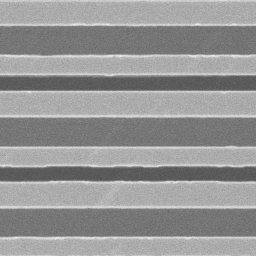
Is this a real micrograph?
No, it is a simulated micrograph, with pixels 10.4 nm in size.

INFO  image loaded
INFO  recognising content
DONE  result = lines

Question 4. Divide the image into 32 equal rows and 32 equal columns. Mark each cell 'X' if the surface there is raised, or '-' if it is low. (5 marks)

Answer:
XXXXXXXXXXXXXXXXXXXXXXXXXXXXXXXX
XXXXXXXXXXXXXXXXXXXXXXXXXXXXXXXX
XXXXXXXXXXXXXXXXXXXXXXXXXXXXXXXX
--------------------------------
--------------------------------
--------------------------------
--------------------------------
XXXXXXXXXXXXXXXXXXXXXXXXXXXXXXXX
XXXXXXXXXXXXXXXXXXXXXXXXXXXXXXXX
--------------------------------
--------------------------------
XXXXXXXXXXXXXXXXXXXXXXXXXXXXXXXX
XXXXXXXXXXXXXXXXXXXXXXXXXXXXXXXX
XXXXXXXXXXXXXXXXXXXXXXXXXXXXXXXX
XXXXXXXXXXXXXXXXXXXXXXXXXXXXXXXX
--------------------------------
--------------------------------
--------------------------------
XXXXXXXXXXXXXXXXXXXXXXXXXXXXXXXX
XXXXXXXXXXXXXXXXXXXXXXXXXXXXXXXX
XXXXXXXXXXXXXXXXXXXXXXXXXXXXXXXX
--------------------------------
--------------------------------
XXXXXXXXXXXXXXXXXXXXXXXXXXXXXXXX
XXXXXXXXXXXXXXXXXXXXXXXXXXXXXXXX
XXXXXXXXXXXXXXXXXXXXXXXXXXXXXXXX
--------------------------------
--------------------------------
--------------------------------
--------------------------------
XXXXXXXXXXXXXXXXXXXXXXXXXXXXXXXX
XXXXXXXXXXXXXXXXXXXXXXXXXXXXXXXX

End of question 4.